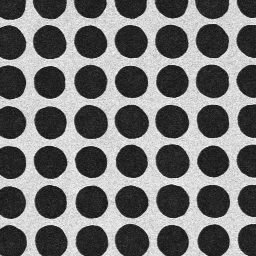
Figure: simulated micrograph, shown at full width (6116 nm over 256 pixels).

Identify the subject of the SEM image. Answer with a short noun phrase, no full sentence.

a regular array of holes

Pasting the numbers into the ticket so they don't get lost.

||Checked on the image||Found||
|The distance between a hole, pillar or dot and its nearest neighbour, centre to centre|950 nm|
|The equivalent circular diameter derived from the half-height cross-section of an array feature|800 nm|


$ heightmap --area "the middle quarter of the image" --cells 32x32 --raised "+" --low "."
+++++...+++++++..+++++++++...+++
++++......++++......++++......++
+++.......+++.......+++........+
++.........++........++........+
++.........++........++........+
+++........++........++........+
+++.......+++........+++.......+
++++......++++......++++......++
++++++..+++++++++.+++++++++.++++
++++++++++++++++++++++++++++++++
+++++..++++++++...+++++++....+++
++++.....+++++......++++......++
+++........++........++........+
.++........++........++........+
.+.........++........++........+
.++........++........++........+
+++........++........++........+
++++......++++......++++......++
+++++....++++++....++++++++.++++
++++++++++++++++++++++++++++++++
++++++.++++++++...+++++++....+++
++++.....+++++......++++......++
+++.......+++.......+++........+
.++........++........++........+
.++........++........++.........
.++........++........++........+
+++.......+++.......++++.......+
++++......+++++.....++++......++
+++++++++++++++++.++++++++..++++
++++++++++++++++++++++++++++++++
++++++..++++++++.++++++++....+++
++++......++++......++++......++